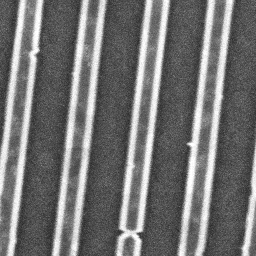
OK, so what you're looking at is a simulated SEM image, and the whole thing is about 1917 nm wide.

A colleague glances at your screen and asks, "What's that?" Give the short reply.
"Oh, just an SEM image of one or a few lines or trenches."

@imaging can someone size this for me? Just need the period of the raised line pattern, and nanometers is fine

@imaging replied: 470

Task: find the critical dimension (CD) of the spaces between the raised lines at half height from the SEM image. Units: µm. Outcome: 0.334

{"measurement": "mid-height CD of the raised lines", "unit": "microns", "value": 0.131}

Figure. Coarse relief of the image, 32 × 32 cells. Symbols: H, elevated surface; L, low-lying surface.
LLLHHLLLLLLHHLLLLLLHHLLLLLHHHLLL
LLLHHLLLLLHHHLLLLLHHHLLLLLHHHLLL
LLLHHLLLLLHHHLLLLLHHLLLLLLHHLLLL
LLHHHLLLLLHHLLLLLLHHLLLLLLHHLLLL
LLHHHLLLLLHHLLLLLLHHLLLLLLHHLLLL
LLHHLLLLLLHHLLLLLLHHLLLLLLHHLLLL
LLHHLLLLLLHHLLLLLLHHLLLLLLHHLLLL
LLHHLLLLLLHHLLLLLLHHLLLLLLHHLLLL
LLHHLLLLLLHHLLLLLLHHLLLLLHHHLLLL
LLHHLLLLLLHHLLLLLHHHLLLLLHHHLLLL
LLHHLLLLLHHHLLLLLHHHLLLLLHHLLLLL
LHHHLLLLLHHHLLLLLHHLLLLLLHHLLLLL
LHHHLLLLLHHLLLLLLHHLLLLLLHHLLLLL
LHHLLLLLLHHLLLLLLHHLLLLLLHHLLLLL
LHHLLLLLLHHLLLLLLHHLLLLLLHHLLLLL
LHHLLLLLLHHLLLLLLHHLLLLLLHHLLLLL
LHHLLLLLLHHLLLLLLHHLLLLLHHHLLLLL
LHHLLLLLLHHLLLLLLHHLLLLLHHHLLLLL
LHHLLLLLHHHLLLLLHHHLLLLLHHHLLLLL
HHHLLLLLHHHLLLLLHHLLLLLLHHHLLLLL
HHHLLLLLHHHLLLLLHHLLLLLLHHLLLLLL
HHHLLLLLHHLLLLLLHHLLLLLLHHLLLLLL
HHLLLLLLHHLLLLLLHHLLLLLLHHLLLLLL
HHLLLLLLHHLLLLLLHHLLLLLLHHLLLLLL
HHLLLLLLHHLLLLLLHHLLLLLLHHLLLLLL
HHLLLLLLHHLLLLLLHHLLLLLHHHLLLLLL
HHLLLLLLHHLLLLLHHHLLLLLHHHLLLLLH
HHLLLLLHHHLLLLLHHHLLLLLHHHLLLLLH
HHLLLLLHHHLLLLLHHLLLLLLHHLLLLLLH
HHLLLLLHHLLLLLLHHLLLLLLHHLLLLLLH
HLLLLLLHHLLLLLLHHLLLLLLHHLLLLLLH
HLLLLLLHHLLLLLLHHLLLLLLHHLLLLLLH